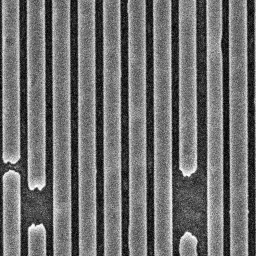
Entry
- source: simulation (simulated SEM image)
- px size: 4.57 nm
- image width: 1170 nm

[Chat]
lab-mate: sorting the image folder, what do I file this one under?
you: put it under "parallel lines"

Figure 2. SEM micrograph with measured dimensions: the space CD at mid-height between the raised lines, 40 nanometers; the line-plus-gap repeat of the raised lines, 116 nm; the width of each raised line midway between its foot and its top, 75.5 nanometres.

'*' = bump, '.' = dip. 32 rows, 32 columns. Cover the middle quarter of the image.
*...****..****..****...****..***
*...****..****..****...****..***
*...****..****..****...****..***
*...****..****..****...****..***
*...****..****..****...****..***
*...****..****..****...****..***
*...****..****..****...****..***
*...****..****..****...****..***
*...****..****..****...****..***
*...****..****..****...****..***
*...****..****..****...****..***
*...****..****..****...****..***
*...****..****..****...****..***
*...****..****..****...****..***
*...****..****..****...****..***
*...****..****..****...****..***
*...****..****..****...****..***
*...****..****..****...****..***
*...****..****..****...****..***
*...****..****..****...****..***
*...****..****..****...****..***
*...****..****..****...****..***
*...****..****..****...****..***
*...****..****..****...****..***
*...****..****..****...****..***
*...****..****..****...****..***
*...****..****..****...****..***
*...****..****..****...****...**
*...****..****...***...****.....
**..****..****...***...****.....
**..****..****...***...****.....
**..****..****...***...****.....